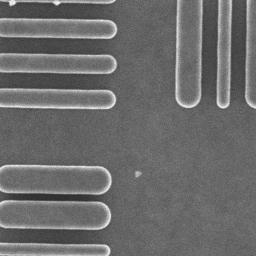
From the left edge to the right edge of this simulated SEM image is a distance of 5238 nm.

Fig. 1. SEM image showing groups of lines, slits or small figures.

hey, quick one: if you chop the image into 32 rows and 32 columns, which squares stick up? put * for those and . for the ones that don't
.*....................***..**..*
......................***..**..*
*********.............***..**..*
**************........***..**..*
.*************........***..**..*
......................***..**..*
......................***..**..*
**************........***..**..*
**************........***..**..*
......................***..**..*
......................***..**..*
**************........***..**..*
**************........***..**..*
................................
................................
................................
................................
................................
................................
................................
................................
*************...................
**************..................
**************..................
................................
*************...................
**************..................
**************..................
....*********...................
................................
*...............................
**************..................